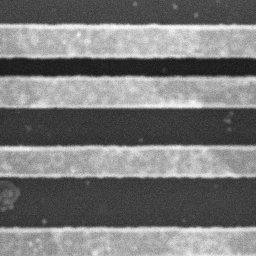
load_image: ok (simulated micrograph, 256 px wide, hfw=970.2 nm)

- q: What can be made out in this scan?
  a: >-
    lines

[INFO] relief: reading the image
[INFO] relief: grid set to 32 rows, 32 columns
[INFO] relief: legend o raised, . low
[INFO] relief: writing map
................................
................................
................................
oooooooooooooooooooooooooooooooo
oooooooooooooooooooooooooooooooo
oooooooooooooooooooooooooooooooo
oooooooooooooooooooooooooooooooo
................................
................................
................................
oooooooooooooooooooooooooooooooo
oooooooooooooooooooooooooooooooo
oooooooooooooooooooooooooooooooo
................................
................................
................................
................................
................................
..........ooooo...oooooooooooooo
oooooooooooooooooooooooooooooooo
oooooooooooooooooooooooooooooooo
oooooooooooooooooooooooooooooooo
................................
................................
................................
................................
................................
................................
................................
oooooooooooooooooooooooooooooooo
oooooooooooooooooooooooooooooooo
oooooooooooooooooooooooooooooooo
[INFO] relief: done